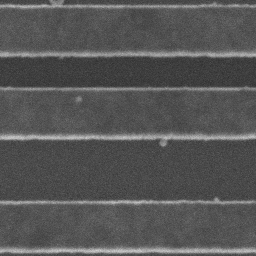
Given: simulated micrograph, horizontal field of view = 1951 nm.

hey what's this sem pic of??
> lines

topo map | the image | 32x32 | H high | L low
LLLLLLLLLLLLLLLLLLLLLLLLLLLLLLLL
HHHHHHHHHHHHHHHHHHHHHHHHHHHHHHHH
HHHHHHHHHHHHHHHHHHHHHHHHHHHHHHHH
HHHHHHHHHHHHHHHHHHHHHHHHHHHHHHHH
HHHHHHHHHHHHHHHHHHHHHHHHHHHHHHHH
HHHHHHHHHHHHHHHHHHHHHHHHHHHHHHHH
HHHHHHHHHHHHHHHHHHHHHHHHHHHHHHHH
LLLLLLLLLLLLLLLLLLLLLLLLLLLLLLLL
LLLLLLLLLLLLLLLLLLLLLLLLLLLLLLLL
LLLLLLLLLLLLLLLLLLLLLLLLLLLLLLLL
LLLLLLLLLLLLLLLLLLLLLLLLLLLLLLLL
HHHHHHHHHHHHHHHHHHHHHHHHHHHHHHHH
HHHHHHHHHHHHHHHHHHHHHHHHHHHHHHHH
HHHHHHHHHHHHHHHHHHHHHHHHHHHHHHHH
HHHHHHHHHHHHHHHHHHHHHHHHHHHHHHHH
HHHHHHHHHHHHHHHHHHHHHHHHHHHHHHHH
HHHHHHHHHHHHHHHHHHHHHHHHHHHHHHHH
LLLLLLLLLLLLLLLLLLLLLLLLLLLLLLLL
LLLLLLLLLLLLLLLLLLLLLLLLLLLLLLLL
LLLLLLLLLLLLLLLLLLLLLLLLLLLLLLLL
LLLLLLLLLLLLLLLLLLLLLLLLLLLLLLLL
LLLLLLLLLLLLLLLLLLLLLLLLLLLLLLLL
LLLLLLLLLLLLLLLLLLLLLLLLLLLLLLLL
LLLLLLLLLLLLLLLLLLLLLLLLLLLLLLLL
LLLLLLLLLLLLLLLLLLLLLLLLLLLLLLLL
HHHHHHHHHHHHHHHHHHHHHHHHHHHHHHHH
HHHHHHHHHHHHHHHHHHHHHHHHHHHHHHHH
HHHHHHHHHHHHHHHHHHHHHHHHHHHHHHHH
HHHHHHHHHHHHHHHHHHHHHHHHHHHHHHHH
HHHHHHHHHHHHHHHHHHHHHHHHHHHHHHHH
HHHHHHHHHHHHHHHHHHHHHHHHHHHHHHHH
LHHHHLHLLLHHHHLHHHHLLHHHHHLHHHHL